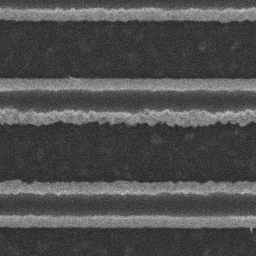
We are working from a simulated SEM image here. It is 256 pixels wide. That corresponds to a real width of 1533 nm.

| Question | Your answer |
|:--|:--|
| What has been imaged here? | one or a few lines or trenches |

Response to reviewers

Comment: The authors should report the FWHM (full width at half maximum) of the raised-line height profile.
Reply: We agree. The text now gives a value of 204 nm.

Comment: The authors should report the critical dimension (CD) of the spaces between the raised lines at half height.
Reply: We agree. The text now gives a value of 413 nanometers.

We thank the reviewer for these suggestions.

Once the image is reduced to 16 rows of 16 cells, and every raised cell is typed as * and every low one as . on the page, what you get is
****************
................
................
................
................
****************
****************
...........**...
................
................
................
................
****************
****************
................
................